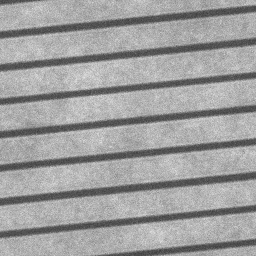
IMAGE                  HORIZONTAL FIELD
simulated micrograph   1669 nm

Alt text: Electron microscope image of parallel lines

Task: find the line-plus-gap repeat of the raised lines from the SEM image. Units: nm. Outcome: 217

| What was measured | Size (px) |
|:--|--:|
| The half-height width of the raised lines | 24.5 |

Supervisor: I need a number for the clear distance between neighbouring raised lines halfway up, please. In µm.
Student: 0.0575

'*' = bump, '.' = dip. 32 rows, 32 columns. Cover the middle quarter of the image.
.*******************************
********************************
********************************
******************************..
********************............
***********.....................
*.......................********
..............******************
.....***************************
********************************
********************************
********************************
************************........
**************..................
*****....................*******
................****************
......**************************
********************************
********************************
********************************
****************************....
****************................
******.......................***
...................*************
..........**********************
********************************
********************************
********************************
*******************************.
**********************..........
**********......................
.........................*******